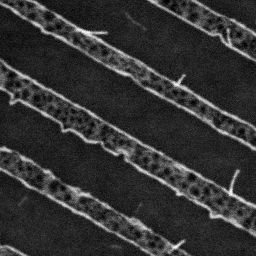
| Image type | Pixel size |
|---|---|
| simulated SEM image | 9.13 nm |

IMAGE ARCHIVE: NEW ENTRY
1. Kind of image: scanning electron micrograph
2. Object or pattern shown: one or a few lines or trenches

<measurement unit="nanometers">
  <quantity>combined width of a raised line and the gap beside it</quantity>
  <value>658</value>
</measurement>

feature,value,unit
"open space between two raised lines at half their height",457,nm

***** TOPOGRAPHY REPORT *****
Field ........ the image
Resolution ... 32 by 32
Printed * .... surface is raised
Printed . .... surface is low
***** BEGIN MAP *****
*****..............******.......
..****...............******.....
...*****...............******...
.....*****...............******.
.......*****...............*****
.........****...............****
..........*****...............**
............*****...............
*.............*****.............
***.............****............
*****............*****..........
.******............*****........
..******.............****.......
....******.............****.....
......******.............****...
.......*******............*****.
.........******.............****
...........******.............**
.............******.............
***............******...........
****.............*****..........
.*****............******........
..*****.............******......
....*****.............******....
......*****............******...
........*****............******.
.........******...........******
...........*****............****
.............*****............**
...............*****............
.................****...........
**................*****.........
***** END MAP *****